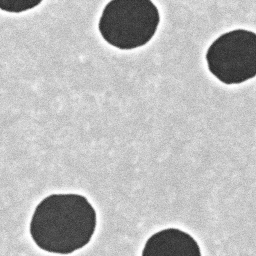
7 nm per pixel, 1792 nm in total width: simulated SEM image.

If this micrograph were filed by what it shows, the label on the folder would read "holes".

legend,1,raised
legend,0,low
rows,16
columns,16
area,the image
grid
0011111000111111
1111110000111111
1111111001111000
1111111111111000
1111111111111000
1111111111111111
1111111111111111
1111111111111111
1111111111111111
1111111111111111
1111111111111111
1111111111111111
1110011111111111
1100001111111111
1100001111001111
1110011110001111